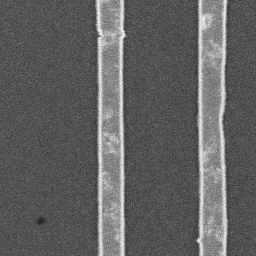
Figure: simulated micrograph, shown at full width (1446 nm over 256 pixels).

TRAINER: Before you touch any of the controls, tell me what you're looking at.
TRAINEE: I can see one or a few lines or trenches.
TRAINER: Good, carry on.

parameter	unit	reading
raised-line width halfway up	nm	124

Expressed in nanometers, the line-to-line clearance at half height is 446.